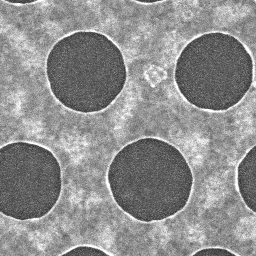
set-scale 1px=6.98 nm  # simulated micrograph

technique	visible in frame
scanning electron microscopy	holes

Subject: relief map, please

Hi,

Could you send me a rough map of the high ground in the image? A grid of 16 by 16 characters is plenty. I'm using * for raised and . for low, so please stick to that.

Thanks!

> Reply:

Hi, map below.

****************
****************
****...*****...*
***.....***.....
***.....***.....
***.....***.....
****...*****...*
****************
****************
...****....*****
....***.....***.
....***.....***.
....***.....***.
*..*****...*****
****************
*****.**********